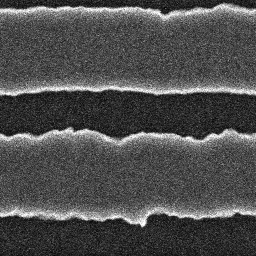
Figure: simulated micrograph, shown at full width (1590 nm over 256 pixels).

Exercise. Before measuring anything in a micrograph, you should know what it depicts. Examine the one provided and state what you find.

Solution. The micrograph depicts one or a few lines or trenches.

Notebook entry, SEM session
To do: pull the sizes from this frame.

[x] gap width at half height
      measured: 0.266 µm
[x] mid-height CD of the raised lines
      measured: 507 nanometres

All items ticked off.